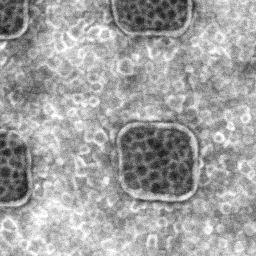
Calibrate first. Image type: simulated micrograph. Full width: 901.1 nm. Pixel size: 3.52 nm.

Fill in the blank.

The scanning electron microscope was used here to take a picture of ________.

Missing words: raised bodies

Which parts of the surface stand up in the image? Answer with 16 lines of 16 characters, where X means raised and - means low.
XX-----XXXXX----
XX-----XXXXX----
----------------
----------------
----------------
----------------
----------------
----------------
X------XXXXX----
XX-----XXXXX----
XX-----XXXXX----
XX------XXXX----
XX--------------
----------------
----------------
----------------